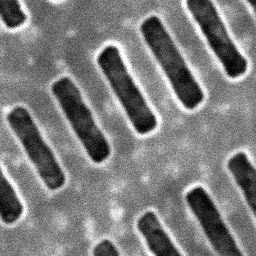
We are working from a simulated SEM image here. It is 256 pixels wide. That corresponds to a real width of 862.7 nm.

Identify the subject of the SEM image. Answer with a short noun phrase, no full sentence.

holes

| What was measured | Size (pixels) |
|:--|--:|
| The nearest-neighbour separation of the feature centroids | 52.9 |